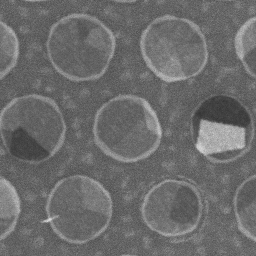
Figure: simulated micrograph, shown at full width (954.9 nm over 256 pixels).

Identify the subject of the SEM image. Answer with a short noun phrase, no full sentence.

raised bodies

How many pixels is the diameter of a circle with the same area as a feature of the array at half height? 64.2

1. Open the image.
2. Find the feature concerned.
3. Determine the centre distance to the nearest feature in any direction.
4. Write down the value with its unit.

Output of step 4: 346 nm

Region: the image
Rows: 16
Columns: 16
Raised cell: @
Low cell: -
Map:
----------------
----@@----@@----
@--@@@@--@@@@--@
@--@@@@--@@@@--@
----@@----@@----
----------------
-@@----@@----@@-
@@@@--@@@@--@@@@
@@@@--@@@@--@@@@
-@@----@@----@@-
----------------
----@@----@@---@
@--@@@@--@@@---@
@--@@@@--@@@---@
----@@----@@---@
----------------